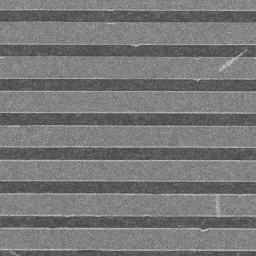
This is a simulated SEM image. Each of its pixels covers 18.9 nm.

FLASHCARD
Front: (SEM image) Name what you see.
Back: parallel lines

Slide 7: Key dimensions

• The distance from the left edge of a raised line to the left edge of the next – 648 nm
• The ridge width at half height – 406 nanometers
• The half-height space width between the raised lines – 0.243 µm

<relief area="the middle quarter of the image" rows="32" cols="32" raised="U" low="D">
UUUUUUUUUUUUUUUUUUUUUUUUUUUUUUUU
UUUUUUUUUUUUUUUUUUUUUUUUUUUUUUUU
UUUUUUUUUUUUUUUUUUUUUUUUUUUUUUUU
DDDDDDDDDDDDDDDDDDDDDDDDDDDDDUUU
DDDDDDDDDDDDDDDDDDUDDDDDDDDDDDDD
DDDDDDDDDDDDDDDDDDDDDDDDDDDDDDDD
DDDDDDDDDDDDDDDDDDDDDDDDDDDDDDDD
UUUUUUUUUUUUUUUUUUUUUUUUUUUUUUUU
UUUUUUUUUUUUUUUUUUUUUUUUUUUUUUUU
UUUUUUUUUUUUUUUUUUUUUUUUUUUUUUUU
UUUUUUUUUUUUUUUUUUUUUUUUUUUUUUUU
UUUUUUUUUUUUUUUUUUUUUUUUUUUUUUUU
DDDDDDDDDDDDDDDDDDDDDDDDDDDDDDDD
DDDDDDDDDDDDDDDDDDUUDDDDDDDDDDDD
DDDDDDDDDDDDDDDDDDDUDDDDDDDDDDDD
UUUUUUUUDDDDDDDDDDDDDDDDDDDDDDDD
UUUUUUUUUUUUUUUUUUUUUUUUUUUUUUUU
UUUUUUUUUUUUUUUUUUUUUUUUUUUUUUUU
UUUUUUUUUUUUUUUUUUUUUUUUUUUUUUUU
UUUUUUUUUUUUUUUUUUUUUUUUUUUUUUUU
UUUUUUUUUUUUUUUUUUUUUUUUUUUUUUUU
DDDDDDDDDDDDDDDDDDDDDDDDDDDDDDDD
DDDDDDDDDDDDDDDDDDDDDDDDDDDDDDDD
DDDDDDDDDDDDDDDDDDDDDDDDDDDDDDDD
UUUUUUUUUUUUUUUUUUUUUUUUUUUUUUUU
UUUUUUUUUUUUUUUUUUUUUUUUUUUUUUUU
UUUUUUUUUUUUUUUUUUUUUUUUUUUUUUUU
UUUUUUUUUUUUUUUUUUUUUUUUUUUUUUUU
UUUUUUUUUUUUUUUUUUUUUUUUUUUUUUUU
DDDDDDDDDDDDDDDDDDDDDDDDDDDDDDDD
DDDDDDDDDDDDDDDDDDDDDDDDDDDDDUDD
DDDDDDDDDDDDDDDDDDDDDDDUDUDDDDDD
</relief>